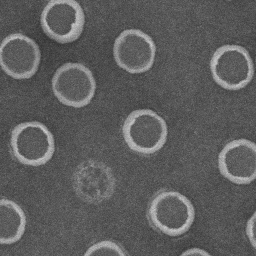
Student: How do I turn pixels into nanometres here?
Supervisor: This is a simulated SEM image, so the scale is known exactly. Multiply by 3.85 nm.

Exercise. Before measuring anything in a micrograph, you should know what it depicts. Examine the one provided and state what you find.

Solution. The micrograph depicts raised bodies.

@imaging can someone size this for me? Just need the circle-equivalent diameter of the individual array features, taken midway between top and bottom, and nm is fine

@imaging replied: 154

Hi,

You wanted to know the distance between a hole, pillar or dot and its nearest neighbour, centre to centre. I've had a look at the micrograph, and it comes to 292 nm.